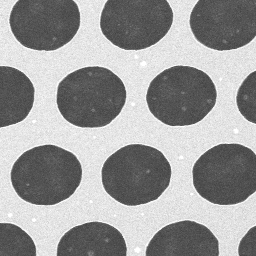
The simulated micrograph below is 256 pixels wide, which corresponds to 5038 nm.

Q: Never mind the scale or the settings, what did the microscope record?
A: holes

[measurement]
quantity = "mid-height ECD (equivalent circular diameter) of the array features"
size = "1290 nm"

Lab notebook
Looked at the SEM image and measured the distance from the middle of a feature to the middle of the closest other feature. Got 1760 nm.